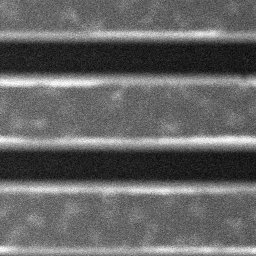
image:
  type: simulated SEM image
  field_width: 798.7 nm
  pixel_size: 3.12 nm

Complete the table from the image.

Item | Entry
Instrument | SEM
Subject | one or a few lines or trenches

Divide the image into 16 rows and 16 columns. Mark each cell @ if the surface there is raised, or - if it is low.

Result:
@@@@@@@@@@@@@@@@
@@@@@@@@@@@@@@@@
----------------
----------------
----------------
@@@@@@@@@@@@@@@@
@@@@@@@@@@@@@@@@
@@@@@@@@@@@@@@@@
@@@@@@@@@@@@@@@@
----------------
----------------
----------------
@@@@@@@@@@@@@@@@
@@@@@@@@@@@@@@@@
@@@@@@@@@@@@@@@@
@@@@@@@@@@@@@@@@